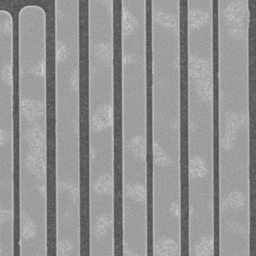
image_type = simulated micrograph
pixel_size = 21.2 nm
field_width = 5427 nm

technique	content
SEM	parallel lines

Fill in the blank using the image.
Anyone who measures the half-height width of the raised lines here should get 517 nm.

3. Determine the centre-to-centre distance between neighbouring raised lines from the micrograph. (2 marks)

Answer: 710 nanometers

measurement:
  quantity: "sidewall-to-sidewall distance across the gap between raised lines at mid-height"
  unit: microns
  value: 0.196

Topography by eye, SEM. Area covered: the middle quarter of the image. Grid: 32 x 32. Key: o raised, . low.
oooo..oooooo...ooooo..ooooooo..o
oooo...ooooo...ooooo..ooooooo..o
oooo..oooooo...ooooo..ooooooo..o
oooo..oooooo...ooooo..ooooooo..o
oooo..oooooo...ooooo..ooooooo..o
oooo..oooooo...ooooo..ooooooo..o
oooo..oooooo...ooooo..ooooooo..o
oooo..oooooo...ooooo..ooooooo..o
oooo..oooooo...ooooo..ooooooo..o
oooo..oooooo...ooooo..ooooooo..o
oooo..oooooo...ooooo..ooooooo..o
oooo..oooo.o...ooooo..ooooooo..o
oooo..oooo.o...ooooo..ooooooo..o
oooo..oooo.o...ooooo..ooooooo..o
oooo..oooooo...ooooo..ooooooo..o
oooo..oooooo...ooooo..ooooooo..o
oooo..oooooo...ooooo..ooooooo..o
oooo..oooooo...ooooo..ooooooo..o
oooo..oooooo...ooooo..ooooooo..o
oooo..oooooo...ooooo..ooooooo..o
oooo..oooooo...ooooo..ooooooo..o
oooo...ooooo...ooooo..ooooooo..o
oooo...ooooo...ooooo..ooooooo..o
oooo...ooooo...ooooo..ooooooo..o
oooo...ooooo...ooooo..ooooooo..o
oooo..oooooo...ooooo..ooooooo..o
oooo..oooooo...ooooo..ooooooo..o
oooo..oooooo...ooooo..ooooooo..o
oooo..oooooo...ooooo..ooooooo..o
oooo..oooooo...ooooo..ooooooo..o
oooo...ooooo...ooooo...oooooo..o
oooo...ooooo...ooooo...oooooo..o